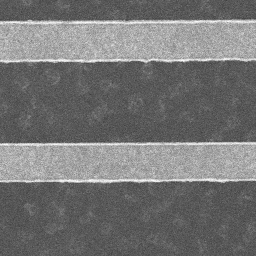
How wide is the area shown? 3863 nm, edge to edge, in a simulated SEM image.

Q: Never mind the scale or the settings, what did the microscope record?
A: one or a few lines or trenches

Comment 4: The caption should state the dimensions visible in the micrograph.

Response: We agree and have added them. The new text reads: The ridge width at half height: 562 nanometres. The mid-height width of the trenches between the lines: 1270 nm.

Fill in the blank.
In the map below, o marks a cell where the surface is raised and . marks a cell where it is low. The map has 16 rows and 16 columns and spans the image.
................
oooooooooooooooo
oooooooooooooooo
oooooooooooooooo
................
................
................
................
................
oooooooooooooooo
oooooooooooooooo
................
................
................
................
................